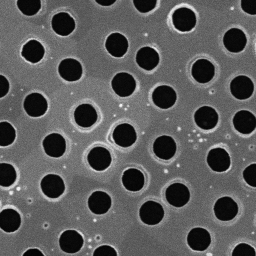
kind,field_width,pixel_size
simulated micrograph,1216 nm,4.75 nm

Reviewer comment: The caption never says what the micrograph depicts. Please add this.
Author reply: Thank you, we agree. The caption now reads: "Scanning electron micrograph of a regular array of holes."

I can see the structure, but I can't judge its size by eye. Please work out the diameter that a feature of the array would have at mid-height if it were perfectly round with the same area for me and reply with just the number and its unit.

0.114 µm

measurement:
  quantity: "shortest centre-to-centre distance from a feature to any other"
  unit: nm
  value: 193